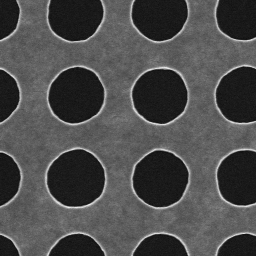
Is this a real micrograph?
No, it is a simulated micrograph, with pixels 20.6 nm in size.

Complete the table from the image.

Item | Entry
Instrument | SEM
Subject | holes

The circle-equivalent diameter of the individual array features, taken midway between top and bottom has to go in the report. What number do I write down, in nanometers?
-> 1160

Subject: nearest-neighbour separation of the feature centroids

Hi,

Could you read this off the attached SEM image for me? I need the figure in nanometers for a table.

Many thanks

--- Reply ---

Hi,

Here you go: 1710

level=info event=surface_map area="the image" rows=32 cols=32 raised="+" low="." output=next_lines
..++++.......++++......++++.....
..++++.......+++........+++.....
..++++.......+++.......++++.....
..++++......+++++......++++.....
.++++++....+++++++....++++++....
++++++++++++++++++++++++++++++++
++++++++++++++++++++++++++++++++
++++++++++++++++++++++++++++++++
+++++++++..+++++++++++++++++++..
.++++++.....++++++.....+++++....
..++++.......++++......++++.....
..++++.......+++.......++++.....
..++++.......++++......++++.....
..++++.......++++......++++.....
.++++++.....++++++....++++++....
++++++++++++++++++++++++++++++++
++++++++++++++++++++++++++++++++
++++++++++++++++++++++++++++++++
++++++++++++++++++++++++++++++++
.++++++.....++++++....++++++....
..++++.......++++......++++.....
..++++.......++++......++++.....
...+++.......++++.......+++.....
..++++.......++++......++++.....
..+++++.....+++++......+++++....
.+++++++...+++++++....+++++++...
++++++++++++++++++++++++++++++++
++++++++++++++++++++++++++++++++
++++++++++++++++++++++++++++++++
++++++++...++++++++...+++++++...
..+++++.....+++++......+++++....
..++++.......++++......++++.....